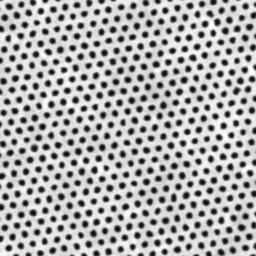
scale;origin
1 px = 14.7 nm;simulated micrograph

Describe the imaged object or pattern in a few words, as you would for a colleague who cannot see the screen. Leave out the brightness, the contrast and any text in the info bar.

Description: a regular array of holes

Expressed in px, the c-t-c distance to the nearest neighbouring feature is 11.6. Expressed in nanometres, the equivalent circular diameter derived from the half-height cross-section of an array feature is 112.